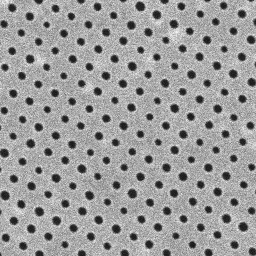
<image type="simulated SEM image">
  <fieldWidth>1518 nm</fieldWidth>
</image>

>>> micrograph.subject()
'a regular array of holes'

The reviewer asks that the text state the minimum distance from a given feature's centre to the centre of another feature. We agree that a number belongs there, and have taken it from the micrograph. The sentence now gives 18.2 pixels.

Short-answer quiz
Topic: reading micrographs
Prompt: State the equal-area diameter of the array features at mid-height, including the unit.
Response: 47.8 nanometers